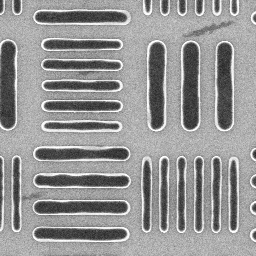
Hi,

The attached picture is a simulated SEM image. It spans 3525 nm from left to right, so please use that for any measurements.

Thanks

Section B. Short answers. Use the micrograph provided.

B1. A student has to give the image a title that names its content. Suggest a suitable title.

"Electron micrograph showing groups of lines, slits or small figures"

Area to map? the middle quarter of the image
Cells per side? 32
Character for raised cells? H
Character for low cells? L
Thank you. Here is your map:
HHHHHHHHHHHHHHLLLLLLLHHHHLLLLHHH
HLLLLLLLHHHHHHLLLLLLLHHHHLLLLLHH
LLLLLLLLLLLLLLLLLLLLLHHHHLLLLLHH
LLLLLLLLLLLLLLLLLLLLLHHHHLLLLLHH
HHHHHHHHHHHHHHLLLLLLLHHHHLLLLLHH
HHHHHHHHHHHHHHLLLLLLLHHHHLLLLHHH
HHHHHHHHHHHHHHLLLLLLLHHHHLLLLHHH
LLLLLLLLLLLLLLLLLLLLLHHHHLLLLHHH
LLLLLLLLLLLLLLLLLLLLLHHHHLLLLHHH
HHHHHHHHHHHHHHLLLLLLLHHHHLLLLHHH
HHHHHHHHHHHHHHLLLLLLLHHHHLLLLHHH
HHHHHHHHHHHHHHLLLLLLLHHHHLLLLHHH
LLLLLLLLLLLLLLLLLLLLLHHHHLLLLHHH
LLLLLLLLLLLLLLLLLLLLLHHHHLLLLHHH
LLLHHHHHHLLLLLLLLLLLLHHHHLLLLHHH
HHHHHHHHHHHHHHLLLLLLLHHHHLLLLLHH
HHHHHHHHHHHHHHLLLLLLLLHHLLLLLLLH
LLLLLLLLLLLLLLLLLLLLLLLLLLLLLLLL
LLLLLLLLLLLLLLLLLLLLLLLLLLLLLLLL
LLLLLLLLLLLLLLLLLLLLLLLLLLLLLLLL
LLLLLLLLLLLLLLLLLLLLLLLLLLLLLLLL
HHHHHHHHHHHHHHHHLLLLLLLLLLLLLLLL
HHHHHHHHHHHHHHHHLLLLLLLLLLLLLLLL
HHHHHHHHHHHHHHHHLLLLLLLLHHLLLHLL
LLLLLLLLLLLLLLLLLLLLHHLLHHLLHHLL
LLLLLLLLLLLLLLLLLLLLHHLLHHLLHHLL
LLLLLLLLLLLLLLLLLLLLHHLLHHLLLHLL
HLLLLLLLLLLLLLLLLLLLHHLLHHLLLHLL
HHHHHHHHHHHHHHHHLLLHHHLLHHLLLHLL
HHHHHHHHHHHHHHHHHLLHHHLLHHLLLHLL
HHHHHHHHHHHHHHHHLLLHHHLLHHLLLHLL
LLLLLLLLLLLLLLLLLLLHHHLLHHLLLHLL